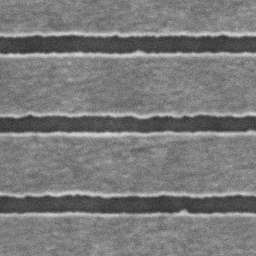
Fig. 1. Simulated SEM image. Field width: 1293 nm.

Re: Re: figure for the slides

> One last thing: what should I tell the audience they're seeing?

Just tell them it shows lines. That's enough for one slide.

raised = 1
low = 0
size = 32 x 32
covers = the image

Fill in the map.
11111111111111111111111111111111
11111111111111111111111111111111
11111111111111111111111111111111
11111111111111111111111111111111
01000000000000010000000000000000
00000000000000000000000000000000
00000000000000000000000000000000
11111111111111111111111111111111
11111111111111111111111111111111
11111111111111111111111111111111
11111111111111111111111111111111
11111111111111111111111111111111
11111111111111111111111111111111
11111111111111111111111111111111
11100000100000100110001000000110
00000000000000000000000000000000
00000000000000000000000000000000
11111111111111111111111111111111
11111111111111111111111111111111
11111111111111111111111111111111
11111111111111111111111111111111
11111111111111111111111111111111
11111111111111111111111111111111
11111111111111111111111111111111
00100000000011000000000011000000
00000000000000000000000000000000
00000000000000000000000000000000
11111111111111111111111111111111
11111111111111111111111111111111
11111111111111111111111111111111
11111111111111111111111111111111
11111111111111111111111111111111